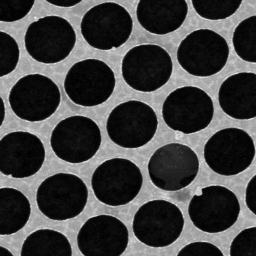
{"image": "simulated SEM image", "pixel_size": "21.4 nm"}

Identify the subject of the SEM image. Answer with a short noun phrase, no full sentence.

a regular array of holes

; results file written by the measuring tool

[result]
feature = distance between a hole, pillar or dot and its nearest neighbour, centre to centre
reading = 1240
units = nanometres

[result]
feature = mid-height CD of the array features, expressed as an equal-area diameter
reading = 1050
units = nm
